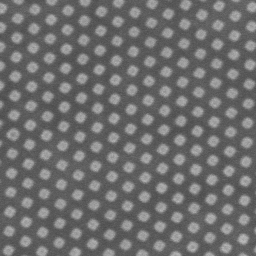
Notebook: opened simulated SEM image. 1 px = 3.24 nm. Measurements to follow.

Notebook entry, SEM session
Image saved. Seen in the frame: a regular array of raised bodies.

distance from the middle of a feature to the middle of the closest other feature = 62.1 nanometres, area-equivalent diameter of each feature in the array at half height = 30.4 nanometers